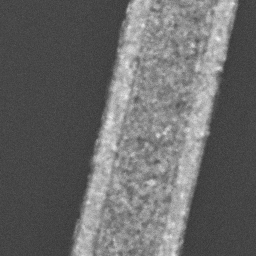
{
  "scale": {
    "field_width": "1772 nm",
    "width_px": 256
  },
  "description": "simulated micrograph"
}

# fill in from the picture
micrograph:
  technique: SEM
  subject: one or a few lines or trenches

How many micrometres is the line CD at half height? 0.58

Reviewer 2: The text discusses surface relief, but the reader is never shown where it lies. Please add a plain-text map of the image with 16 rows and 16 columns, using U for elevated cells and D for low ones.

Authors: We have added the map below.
DDDDDDDDDUUUUUDD
DDDDDDDDDUUUUUDD
DDDDDDDDUUUUUUDD
DDDDDDDDUUUUUDDD
DDDDDDDDUUUUUDDD
DDDDDDDDUUUUUDDD
DDDDDDDUUUUUUDDD
DDDDDDDUUUUUDDDD
DDDDDDDUUUUUDDDD
DDDDDDDUUUUUDDDD
DDDDDDUUUUUUDDDD
DDDDDDUUUUUUDDDD
DDDDDDUUUUUDDDDD
DDDDDDUUUUUDDDDD
DDDDDUUUUUUDDDDD
DDDDDUUUUUUDDDDD